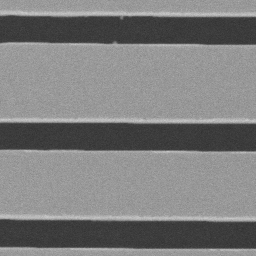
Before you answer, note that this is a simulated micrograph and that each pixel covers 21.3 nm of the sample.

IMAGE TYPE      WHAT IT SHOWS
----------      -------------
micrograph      lines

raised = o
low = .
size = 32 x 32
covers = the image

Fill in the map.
oooooooooooooooooooooooooooooooo
oooooooooooooooooooooooooooooooo
................................
................................
................................
ooooooooooooo...................
oooooooooooooooooooooooooooooooo
oooooooooooooooooooooooooooooooo
oooooooooooooooooooooooooooooooo
oooooooooooooooooooooooooooooooo
oooooooooooooooooooooooooooooooo
oooooooooooooooooooooooooooooooo
oooooooooooooooooooooooooooooooo
oooooooooooooooooooooooooooooooo
oooooooooooooooooooooooooooooooo
................................
................................
................................
................................
oooooooooooooooooooooooooooooooo
oooooooooooooooooooooooooooooooo
oooooooooooooooooooooooooooooooo
oooooooooooooooooooooooooooooooo
oooooooooooooooooooooooooooooooo
oooooooooooooooooooooooooooooooo
oooooooooooooooooooooooooooooooo
oooooooooooooooooooooooooooooooo
..............oooooooooooooooooo
................................
................................
................................
oooooooooooooooooooooooooooooooo